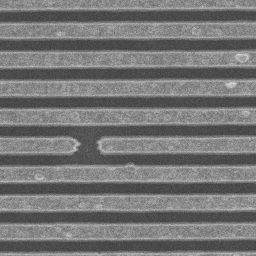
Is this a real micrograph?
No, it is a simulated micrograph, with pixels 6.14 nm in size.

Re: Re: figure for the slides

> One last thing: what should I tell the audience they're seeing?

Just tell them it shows parallel lines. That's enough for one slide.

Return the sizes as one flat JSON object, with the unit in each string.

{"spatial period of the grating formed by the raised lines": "176 nm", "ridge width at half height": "98.3 nanometers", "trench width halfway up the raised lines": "0.0768 µm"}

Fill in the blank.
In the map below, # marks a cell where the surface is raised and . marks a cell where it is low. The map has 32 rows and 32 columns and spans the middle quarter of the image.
################################
................................
................................
................................
################################
################################
################################
################################
................................
................................
................................
################################
################################
################################
################################
................................
................................
................................
##............#...#####.#.......
###......#######################
###......#######################
###......#######################
................................
................................
................................
..............####..............
################################
################################
################################
..............................#.
................................
................................